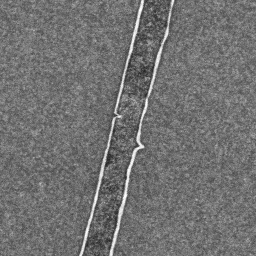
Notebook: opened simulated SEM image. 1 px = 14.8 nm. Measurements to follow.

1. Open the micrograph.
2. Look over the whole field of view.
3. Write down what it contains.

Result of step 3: one or a few lines or trenches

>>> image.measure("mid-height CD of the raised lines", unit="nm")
421